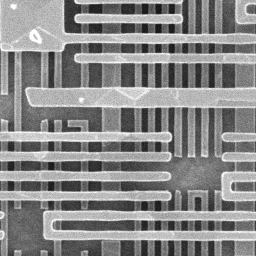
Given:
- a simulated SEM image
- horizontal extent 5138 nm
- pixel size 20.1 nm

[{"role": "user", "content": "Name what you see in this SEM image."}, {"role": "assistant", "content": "wiring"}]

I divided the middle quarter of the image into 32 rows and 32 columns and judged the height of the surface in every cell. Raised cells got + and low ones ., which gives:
................................
................................
................................
................................
................................
................................
++++++++++++++++++++++++++++++++
++++++++++++++++++++++++++++++++
++++++++++++++++++++++++++++++++
++++++++++++++++++++++++++++++++
++++++++++++++++++++++++++++++++
................................
................................
................................
................................
................................
................................
+++++++++++++++++++++++++++.....
+++++++++++++++++++++++++++.....
................................
................................
................................
+++++++++++++++++++++++++++.....
+++++++++++++++++++++++++++.....
................................
................................
................................
++++++++++++++++++++++++++......
+++++++++++++++++++++++++++.....
................................
................................
................................